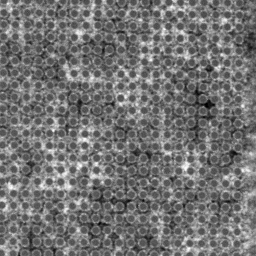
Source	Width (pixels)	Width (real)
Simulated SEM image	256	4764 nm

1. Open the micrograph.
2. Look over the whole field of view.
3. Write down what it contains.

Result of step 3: a regular array of raised bodies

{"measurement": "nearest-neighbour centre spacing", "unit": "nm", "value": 217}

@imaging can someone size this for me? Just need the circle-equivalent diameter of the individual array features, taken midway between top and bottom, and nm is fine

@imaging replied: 155